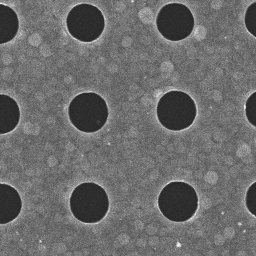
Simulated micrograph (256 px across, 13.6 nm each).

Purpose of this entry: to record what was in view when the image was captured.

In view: holes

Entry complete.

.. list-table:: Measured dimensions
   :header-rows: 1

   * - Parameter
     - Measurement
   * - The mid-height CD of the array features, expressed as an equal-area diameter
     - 541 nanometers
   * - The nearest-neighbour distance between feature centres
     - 1210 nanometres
